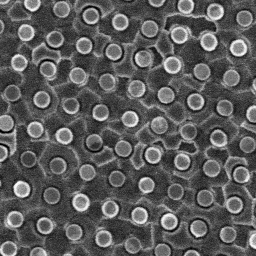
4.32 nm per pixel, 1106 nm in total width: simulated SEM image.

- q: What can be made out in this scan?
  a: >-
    a regular array of raised bodies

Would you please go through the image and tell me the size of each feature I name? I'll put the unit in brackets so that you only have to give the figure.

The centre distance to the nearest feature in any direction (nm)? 130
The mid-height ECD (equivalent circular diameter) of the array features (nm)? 68.7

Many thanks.